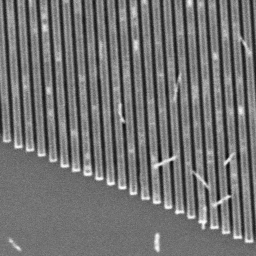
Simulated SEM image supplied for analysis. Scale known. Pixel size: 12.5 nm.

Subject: parallel lines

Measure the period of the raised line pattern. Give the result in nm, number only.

140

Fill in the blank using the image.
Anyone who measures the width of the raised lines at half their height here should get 69.9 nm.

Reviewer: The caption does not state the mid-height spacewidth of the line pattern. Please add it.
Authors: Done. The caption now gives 59.1 nanometres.